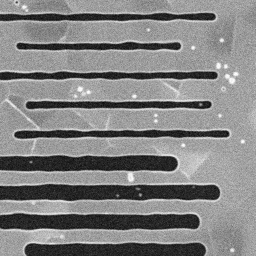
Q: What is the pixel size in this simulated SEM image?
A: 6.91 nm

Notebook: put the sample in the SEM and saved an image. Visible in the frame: groups of lines, slits or small figures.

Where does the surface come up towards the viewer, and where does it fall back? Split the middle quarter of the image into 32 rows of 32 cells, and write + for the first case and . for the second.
++++++++++++++++++++++++++++++++
++++++++++++++++++++++++++++++++
................................
................................
++++++++++++++++++++++++++++++++
++++++++++++++++++++++++++++++++
++++++++++++++++++++++++++++++++
++++++++++++++++++++++++++++++++
++++++++++++++++++++++++++++++++
................................
................................
++++++++++++++++++++++++++++++++
++++++++++++++++++++++++++++++++
++++++++++++++++++++++++++++++++
++++++++++++++++++++++++++++++++
++++++++++++++++++++++++++++++++
....+++.........................
................................
........................+++.....
++++++++++++++++++++++++++++++++
++++++++++++++++++++++++++++++++
++++++++++++++++++++++++++++++++
++++++++++++++++++++++++++++++++
............................++++
.............................+++
............................++++
............................++++
++++++++++++++++++++++++++++++++
++++++++++++++++++++++++++++++++
++++++++++++++++++++++++++++++++
................................
................................